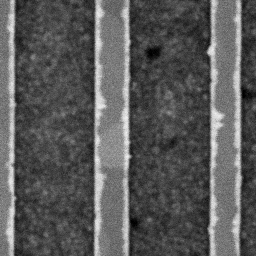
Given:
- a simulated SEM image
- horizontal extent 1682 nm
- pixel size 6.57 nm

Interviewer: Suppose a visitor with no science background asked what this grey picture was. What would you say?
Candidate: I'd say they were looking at one or a few lines or trenches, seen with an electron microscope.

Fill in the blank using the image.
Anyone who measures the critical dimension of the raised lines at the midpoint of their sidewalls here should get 203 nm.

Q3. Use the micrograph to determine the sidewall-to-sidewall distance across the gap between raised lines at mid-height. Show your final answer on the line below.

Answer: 544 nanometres